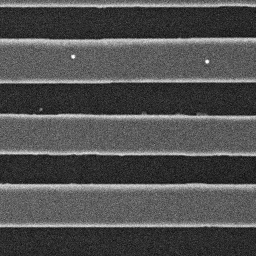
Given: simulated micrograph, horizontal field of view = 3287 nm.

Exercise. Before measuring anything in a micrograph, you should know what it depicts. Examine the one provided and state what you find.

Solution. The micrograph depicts lines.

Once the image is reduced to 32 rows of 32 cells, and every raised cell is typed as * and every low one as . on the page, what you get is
********************************
................................
................................
................................
................................
********************************
********************************
********************************
********************************
********************************
................................
................................
................................
................................
**************..*...............
********************************
********************************
********************************
********************************
................................
................................
................................
................................
********************************
********************************
********************************
********************************
********************************
................................
................................
................................
................................